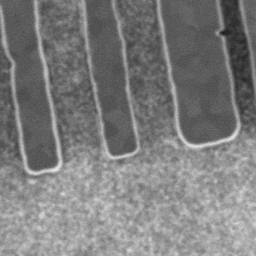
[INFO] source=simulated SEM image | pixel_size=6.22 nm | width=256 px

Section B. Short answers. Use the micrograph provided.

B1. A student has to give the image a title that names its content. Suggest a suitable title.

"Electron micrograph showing one or a few lines or trenches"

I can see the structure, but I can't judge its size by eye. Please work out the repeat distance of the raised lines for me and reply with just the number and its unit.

522 nanometers